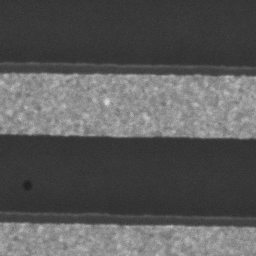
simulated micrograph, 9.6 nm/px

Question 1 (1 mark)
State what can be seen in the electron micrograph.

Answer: lines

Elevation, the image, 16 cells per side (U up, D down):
DDDDDDDDDDDDDDDD
DDDDDDDDDDDDDDDD
DDDDDDDDDDDDDDDD
DDDDDDDDDDDDDDDD
UUUUUUUUUUUUUUUU
UUUUUUUUUUUUUUUU
UUUUUUUUUUUUUUUU
UUUUUUUUUUUUUUUU
DDDDDDDUUUUUUUUU
DDDDDDDDDDDDDDDD
DDDDDDDDDDDDDDDD
DDDDDDDDDDDDDDDD
DDDDDDDDDDDDDDDD
UUUUUUUUDUDDDDDD
UUUUUUUUUUUUUUUU
UUUUUUUUUUUUUUUU